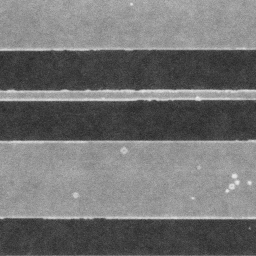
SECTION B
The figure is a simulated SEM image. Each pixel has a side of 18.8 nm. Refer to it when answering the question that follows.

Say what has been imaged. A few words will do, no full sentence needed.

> lines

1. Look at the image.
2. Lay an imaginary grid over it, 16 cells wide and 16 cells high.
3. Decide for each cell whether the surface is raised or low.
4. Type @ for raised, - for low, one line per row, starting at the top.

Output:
@@@@@@@@@@@@@@@@
@@@@@@@@@@@@@@@@
@@@@@@@@@@@@@@@@
----------------
----------------
----------------
----------------
----------------
----------------
@@@@@@@@@@@@@@@@
@@@@@@@@@@@@@@@@
@@@@@@@@@@@@@@@@
@@@@@@@@@@@@@@@@
@@@@@@@@@@@@@@@@
----------------
----------------